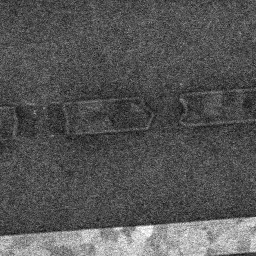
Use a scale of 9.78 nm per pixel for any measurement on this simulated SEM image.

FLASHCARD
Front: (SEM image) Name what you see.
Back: one or a few lines or trenches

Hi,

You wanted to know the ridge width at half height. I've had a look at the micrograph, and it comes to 313 nm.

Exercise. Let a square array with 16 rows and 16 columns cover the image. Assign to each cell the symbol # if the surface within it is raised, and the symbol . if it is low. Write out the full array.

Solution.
................
................
................
................
................
................
....#####..#####
#...#####..#####
#...............
................
................
................
................
................
....############
################